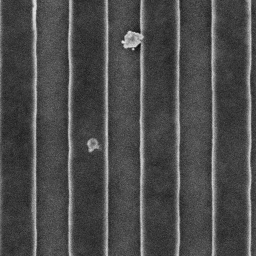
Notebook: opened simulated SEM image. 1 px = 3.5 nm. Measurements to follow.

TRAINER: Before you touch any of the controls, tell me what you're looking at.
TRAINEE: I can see wiring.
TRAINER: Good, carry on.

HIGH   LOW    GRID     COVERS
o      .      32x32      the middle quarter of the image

..ooooooooo........oooooooooo...
..ooooooooo........oooooooooo...
..ooooooooo........oooooooooo...
..ooooooooo........oooooooooo...
..ooooooooo........oooooooooo...
.oooooooooo........oooooooooo...
.oooooooooo........oooooooooo...
.oooooooooo........oooooooooo...
.oooooooooo........oooooooooo...
.oooooooooo........oooooooooo...
.oooooooooo........oooooooooo...
.oooooooooo........oooooooooo...
.oooooooooo........oooooooooo...
.oooooooooo........oooooooooo...
.oooooooooo........oooooooooo...
.oooooooooo........oooooooooo...
.oooooooooo........oooooooooo...
.oooooooooo........oooooooooo...
.oooooooooo........oooooooooo...
.oooooooooo........oooooooooo...
.oooooooooo........oooooooooo...
..ooooooooo........oooooooooo...
.oooooooooo........oooooooooo...
.oooooooooo........oooooooooo...
.oooooooooo........oooooooooo...
.oooooooooo........oooooooooo...
.oooooooooo........oooooooooo...
.oooooooooo........oooooooooo...
.oooooooooo........oooooooooo...
.oooooooooo........oooooooooo...
.oooooooooo........oooooooooo...
.oooooooooo........oooooooooo...